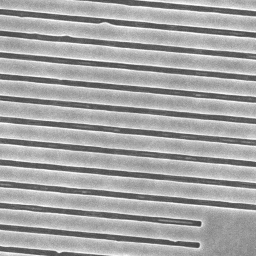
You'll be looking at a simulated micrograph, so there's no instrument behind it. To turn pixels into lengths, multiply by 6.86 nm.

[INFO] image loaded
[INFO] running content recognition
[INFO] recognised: parallel lines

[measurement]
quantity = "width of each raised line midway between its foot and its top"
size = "15.3 px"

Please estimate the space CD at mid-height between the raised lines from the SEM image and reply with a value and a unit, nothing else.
41 nanometres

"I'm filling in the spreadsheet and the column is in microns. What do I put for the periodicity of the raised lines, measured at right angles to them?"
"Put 0.147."